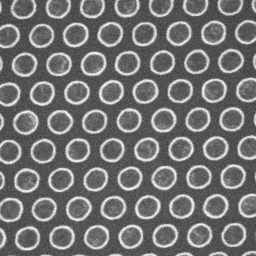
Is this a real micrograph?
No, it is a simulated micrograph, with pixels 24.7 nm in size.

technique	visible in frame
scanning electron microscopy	a regular array of raised bodies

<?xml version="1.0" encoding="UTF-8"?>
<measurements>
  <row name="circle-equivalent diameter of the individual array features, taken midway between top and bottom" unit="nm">557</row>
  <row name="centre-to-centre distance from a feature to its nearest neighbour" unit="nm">821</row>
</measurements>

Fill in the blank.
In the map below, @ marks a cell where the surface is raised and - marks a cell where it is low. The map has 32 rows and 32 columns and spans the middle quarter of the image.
@@--@@@@@@---@@@@@@---@@@@@---@@
@----@@@@----@@@@@----@@@@@----@
------@@-------@----------------
--------------------------------
-----------@@-------@@------@@@-
-@@@@@----@@@@----@@@@@----@@@@@
-@@@@@---@@@@@@---@@@@@---@@@@@@
@@@@@@---@@@@@----@@@@@---@@@@@@
-@@@@----@@@@@----@@@@-----@@@@-
--@@-------@@------@@-----------
--------------------------------
------------------------@@------
@-----@@@@----@@@@@----@@@@----@
@@---@@@@@----@@@@@---@@@@@@---@
@@---@@@@@---@@@@@@---@@@@@@---@
@@---@@@@@----@@@@-----@@@@----@
@-----@@@------@@-------@@------
--------------------------------
--------------------------------
--@@@-----@@@@-----@@@@----@@@@-
-@@@@@----@@@@@---@@@@@----@@@@@
-@@@@@---@@@@@@---@@@@@---@@@@@@
-@@@@@---@@@@@----@@@@@----@@@@@
-@@@@-----@@@@-----@@@-----@@@@-
--------------------------------
--------------------------------
@------@@------@@@------@@@-----
@@----@@@@----@@@@@----@@@@@---@
@@---@@@@@@---@@@@@---@@@@@@---@
@@---@@@@@----@@@@@---@@@@@----@
@----@@@@@----@@@@-----@@@@-----
--------------------------------